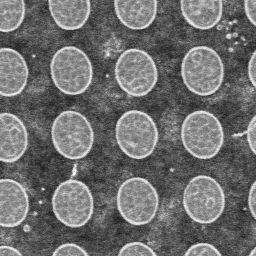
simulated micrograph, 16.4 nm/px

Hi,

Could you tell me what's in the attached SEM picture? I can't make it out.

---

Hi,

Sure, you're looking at a regular array of raised bodies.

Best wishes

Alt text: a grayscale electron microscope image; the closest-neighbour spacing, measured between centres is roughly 1050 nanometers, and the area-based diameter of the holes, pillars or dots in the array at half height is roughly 697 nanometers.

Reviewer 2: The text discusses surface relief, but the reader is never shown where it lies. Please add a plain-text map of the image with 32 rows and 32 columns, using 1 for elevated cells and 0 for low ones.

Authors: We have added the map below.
11100011111000011110000111110001
11100011111000011110000111110001
11100001111000011110000011100001
11000000100000000100000000000000
00000000000000000000000000000000
00000000000000000000000000000000
11000001110000001100000011100000
11100001111000011110000111100001
11100011111000011110000111110001
11100001111000011110000111110001
11100001111000011110000111100000
11000000110000001100000011000000
00000000000000000000000000000000
00000000000000000000000000000000
11000001110000011100000011000000
11100001111000011110000111100001
11100001111000011110000111110001
11100001111000011110000111110001
11100001111000011110000111100000
11000000110000001100000001000000
00000000000000000000000000000000
00000000000000000000000000000000
00000000000000001100000011100000
11100001111000011110000111100000
11100001111000011110000111110001
11100001111000011111000111110001
11100001111000011110000111110000
11100000111000001110000001000000
00000000000000000000000000000000
00000000000000000000000000000000
00000000000000000000000000000000
11000001110000011110000111100000